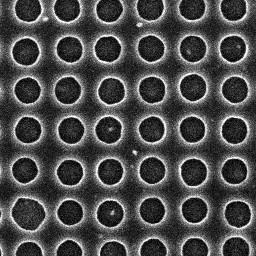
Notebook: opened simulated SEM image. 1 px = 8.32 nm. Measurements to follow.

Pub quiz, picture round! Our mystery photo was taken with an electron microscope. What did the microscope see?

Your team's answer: a regular array of holes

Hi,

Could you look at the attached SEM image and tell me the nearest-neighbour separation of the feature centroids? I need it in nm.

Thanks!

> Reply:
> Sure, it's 332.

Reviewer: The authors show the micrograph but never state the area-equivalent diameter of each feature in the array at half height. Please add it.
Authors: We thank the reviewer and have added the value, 0.224 um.